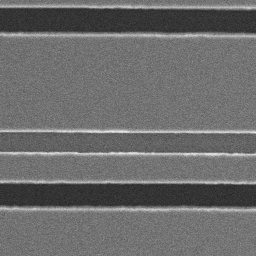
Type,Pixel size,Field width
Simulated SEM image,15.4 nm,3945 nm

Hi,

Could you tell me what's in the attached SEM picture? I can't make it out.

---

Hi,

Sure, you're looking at lines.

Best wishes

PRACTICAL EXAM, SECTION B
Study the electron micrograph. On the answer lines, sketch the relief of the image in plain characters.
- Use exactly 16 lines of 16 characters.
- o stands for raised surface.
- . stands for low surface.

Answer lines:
...............o
................
oooooooooooooooo
oooooooooooooooo
oooooooooooooooo
oooooooooooooooo
oooooooooooooooo
oooooooooooooooo
oooooooooooooooo
oooooooooooooooo
oooooooooooooooo
................
................
oooooooooooooooo
oooooooooooooooo
oooooooooooooooo